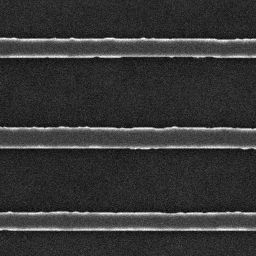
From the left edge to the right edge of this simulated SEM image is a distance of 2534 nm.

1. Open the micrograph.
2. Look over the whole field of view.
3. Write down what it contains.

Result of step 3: lines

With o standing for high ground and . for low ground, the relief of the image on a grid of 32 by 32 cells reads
................................
................................
................................
................................
................................
oooooooooooooooooooooooooooooooo
oooooooooooooooooooooooooooooooo
................................
................................
................................
................................
................................
................................
................................
................................
................................
oooooooooooooooooooooooooooooooo
oooooooooooooooooooooooooooooooo
................oooo..........oo
................................
................................
................................
................................
................................
................................
................................
................................
oooooooooooooooooooooooooooooooo
oooooooooooooooooooooooooooooooo
................................
................................
................................